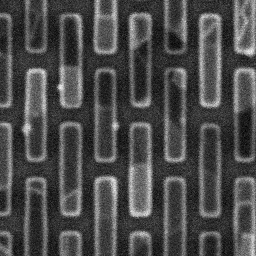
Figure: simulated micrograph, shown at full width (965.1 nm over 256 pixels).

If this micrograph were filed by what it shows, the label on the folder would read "groups of lines, slits or small figures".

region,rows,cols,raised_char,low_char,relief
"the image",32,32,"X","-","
---XXX------XX-------XX------XXX
---XXX------XX-------XX------XXX
X--XXX--XX--XX--XXX--XX--XX--XXX
X--XXX--XX--XX--XXX--XX--XX--XXX
X--XXX--XX--XX--XXX--XX--XX--XXX
X--XXX--XX--XX--XXX--XX--XX--XXX
X-------XX------XXX------XX---XX
X-------XX------XXX------XX-----
X-------XX------XXX------XX-----
X--XXX--XX--XX--XXX--XX--XX--XXX
X--XXX--XX--XX--XXX--XX--XX--XXX
X--XXX--XX--XX---XX--XX--XX--XXX
X--XXX--XX--XX---XX--XX--XX--XXX
---XXX------XX-------XX------XXX
---XXX------XX-------XX------XXX
---XXX------XXX------XX------XXX
X--XXX--XX--XX--XXX--XX--XX--XXX
X--XXX--XX--XX--XXX--XX--XX---XX
X--XXX--XX--XX--XXX--XX--XX--XXX
X--XXX--XX--XX--XXX--XX--XX--XXX
X-------XX------XXX------XX-----
X-------XX------XXX------XX-----
X---X---XX--XX--XXX--XX--XX---XX
X--XXX--XX--XX--XXX--XX--XX--XXX
X--XXX--XX--XX--XXX--XX--XX--XXX
X--XXX--XX--XX--XXX--XX--XX--XXX
X--XXX--XX--XX---XX--XX--XX--XXX
---XXX------XX-------XX------XXX
---XXX------XX-------XX------XXX
X--XXX--XX--XX---XX--XX--XX--XXX
X--XXX--XX--XX--XXX--XX--XX--XXX
X--XXX--XX--XX--XXX--XX--XX--XXX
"